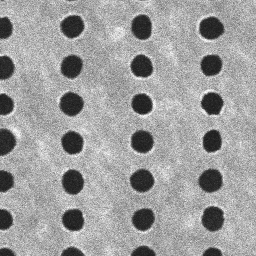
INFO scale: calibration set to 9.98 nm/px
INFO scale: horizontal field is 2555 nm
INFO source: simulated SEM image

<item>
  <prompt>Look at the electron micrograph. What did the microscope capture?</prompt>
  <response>a regular array of holes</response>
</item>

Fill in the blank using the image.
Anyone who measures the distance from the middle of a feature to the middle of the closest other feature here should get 378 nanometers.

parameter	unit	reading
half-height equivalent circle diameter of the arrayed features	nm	226